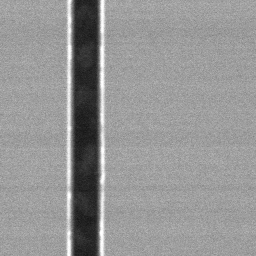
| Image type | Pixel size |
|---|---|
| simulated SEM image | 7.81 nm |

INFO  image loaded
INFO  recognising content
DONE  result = one or a few lines or trenches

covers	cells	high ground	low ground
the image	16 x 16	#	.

####..##########
####..##########
####..##########
####..##########
####..##########
####..##########
####..##########
####..##########
####..##########
####..##########
####..##########
####..##########
####..##########
####..##########
####..##########
####..##########